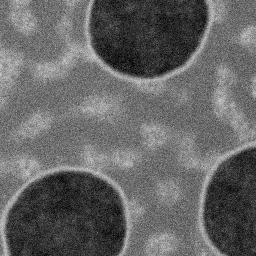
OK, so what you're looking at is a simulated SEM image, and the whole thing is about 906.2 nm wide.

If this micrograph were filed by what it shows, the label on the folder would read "holes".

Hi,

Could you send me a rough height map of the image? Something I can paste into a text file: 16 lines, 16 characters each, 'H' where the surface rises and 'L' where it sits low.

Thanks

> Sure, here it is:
HHHHHHLLLLLLLHHH
HHHHHHLLLLLLLHHH
HHHHHHLLLLLLLHHH
HHHHHHLLLLLLHHHH
HHHHHHHLLLLHHHHH
HHHHHHHHHHHHHHHH
HHHHHHHHHHHHHHHH
HHHHHHHHHHHHHHHH
HHHHHHHHHHHHHHHH
HHHHHHHHHHHHHHHL
HHHHHHHHHHHHHHLL
HHLLLLLHHHHHHLLL
HLLLLLLLHHHHHLLL
LLLLLLLLHHHHHLLL
LLLLLLLLHHHHHLLL
LLLLLLLLHHHHHLLL